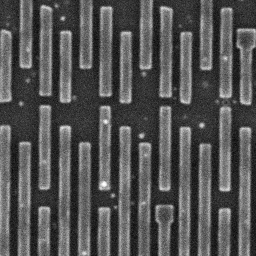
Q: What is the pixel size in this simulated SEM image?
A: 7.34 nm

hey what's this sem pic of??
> wiring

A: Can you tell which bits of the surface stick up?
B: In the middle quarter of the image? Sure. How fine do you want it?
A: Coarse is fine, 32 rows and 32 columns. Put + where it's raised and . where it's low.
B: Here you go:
++..+++..+++..+++..+++..+++..+++
++.......+++..+++.......+++..+++
++.......+++..+++.......+++..+++
++.......+++..+++.......+++..+++
+........+++..+++.......+++..+++
+........+++..+++.......+++..+++
+........+++..++........+++..+++
+........+++..++........+++..+++
+.............++.............+++
..............++..............+.
................................
.........++.............++......
.........++.............++......
.........+++............++......
.........+++............++......
.........+++............++......
+........++...++........++...++.
+........++...++........++...++.
+........++...++........++...++.
+........++...++........++...++.
+...++...++...++...++...++...++.
+...++...++...++...++...++...++.
+...++...++...++...++...++...++.
+...++...++...++...++...++...++.
+...++...++...++...++...++...++.
+...++...++...++...++...++...++.
+...++...++...++...++...++...++.
+...++...++...++...++...++...++.
+...++...++...++...++...++...++.
+...++...++...++...++...++...++.
+...++...++...++...++...++...++.
+...++........++...++....+...++.